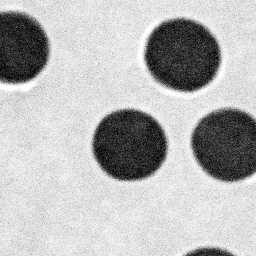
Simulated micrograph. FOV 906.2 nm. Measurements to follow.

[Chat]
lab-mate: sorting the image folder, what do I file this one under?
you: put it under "holes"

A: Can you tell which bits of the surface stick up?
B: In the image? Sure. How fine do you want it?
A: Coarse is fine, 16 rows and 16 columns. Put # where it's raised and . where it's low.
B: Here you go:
################
..########...###
...######.....##
...######.....##
...######.....##
##########...###
################
######....###...
######....##....
######....##....
######....###...
################
################
################
################
############..##